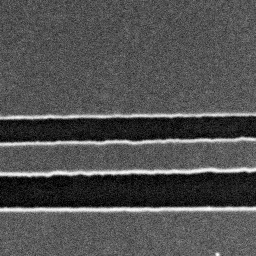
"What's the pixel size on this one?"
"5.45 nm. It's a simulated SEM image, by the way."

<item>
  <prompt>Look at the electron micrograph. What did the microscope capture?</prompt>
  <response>lines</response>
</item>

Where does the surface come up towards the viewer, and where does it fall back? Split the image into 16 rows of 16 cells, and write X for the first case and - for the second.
XXXXXXXXXXXXXXXX
XXXXXXXXXXXXXXXX
XXXXXXXXXXXXXXXX
XXXXXXXXXXXXXXXX
XXXXXXXXXXXXXXXX
XXXXXXXXXXXXXXXX
XXXXXXXXXXXXXXXX
----------------
----------------
XXXXXXXXXXXXXXXX
XXXXXXXXXXXXXXXX
----------------
----------------
XXXXXXXXXXXXXXXX
XXXXXXXXXXXXXXXX
XXXXXXXXXXXXXXXX